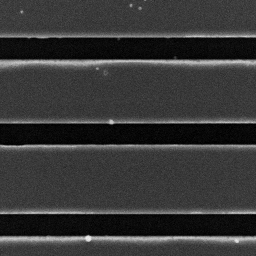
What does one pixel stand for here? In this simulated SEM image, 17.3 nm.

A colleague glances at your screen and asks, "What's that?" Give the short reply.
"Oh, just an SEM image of lines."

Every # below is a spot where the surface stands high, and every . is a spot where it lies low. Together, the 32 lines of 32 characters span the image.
################################
################################
################################
################################
################################
................................
................................
................................
################################
################################
################################
################################
################################
################################
################################
................................
................................
................................
################################
################################
################################
################################
################################
################################
################################
################################
################################
................................
................................
...........#....................
################################
################################